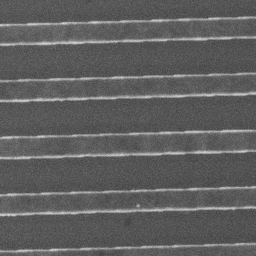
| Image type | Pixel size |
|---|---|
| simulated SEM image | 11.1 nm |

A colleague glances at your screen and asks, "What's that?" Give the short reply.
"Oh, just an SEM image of lines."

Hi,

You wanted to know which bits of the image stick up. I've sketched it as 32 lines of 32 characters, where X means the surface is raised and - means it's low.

--------------------------------
--------------------------------
----------------------XXXXXXXXXX
XXXXXXXXXXXXXXXXXXXXXXXXXXXXXXXX
XXXXXXXXXXXXXXXXXXXXXXXXXXXXXXXX
XXXXXXX-------------------------
--------------------------------
--------------------------------
--------------------------------
---------------------XXXXXXXXXXX
XXXXXXXXXXXXXXXXXXXXXXXXXXXXXXXX
XXXXXXXXXXXXXXXXXXXXXXXXXXXXXXXX
XXXXXXXX------------------------
--------------------------------
--------------------------------
--------------------------------
-----------------------XXXXXXXXX
XXXXXXXXXXXXXXXXXXXXXXXXXXXXXXXX
XXXXXXXXXXXXXXXXXXXXXXXXXXXXXXXX
XXXXXXXXXXX---------------------
--------------------------------
--------------------------------
--------------------------------
---------------------------XXXXX
XXXXXXXXXXXXXXXXXXXXXXXXXXXXXXXX
XXXXXXXXXXXXXXXXXXXXXXXXXXXXXXXX
XXXXXXXXXXXX--------------------
--------------------------------
--------------------------------
--------------------------------
--------------------------------
XXXXXXXXXXXXXXXXXXXXXXXXXXXXXXXX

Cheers